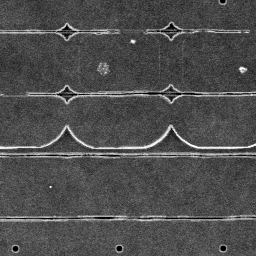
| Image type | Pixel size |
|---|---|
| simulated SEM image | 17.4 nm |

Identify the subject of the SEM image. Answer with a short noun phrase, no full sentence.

wiring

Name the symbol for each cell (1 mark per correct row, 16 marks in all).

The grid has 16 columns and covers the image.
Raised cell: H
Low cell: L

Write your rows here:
HHHHHHHHHHHHHHHH
HHHHHHHHHHHHHHHH
HHHHHHHHHHHHHHHH
HHHHHHHHHHHHHHHH
HHHHHHHHHHHHHHHH
HHHHHHHHHHHHHHHH
HHHHHHHHHHHHHHHH
HHHHHHHHHHHHHHHH
HHHHLHHHHHLHHHHH
LLLLLLLLLLLLLLLL
LLLLLLLLLLLLLLLL
LLLLLLLLLLLLLLLL
LLLLLLLLLLLLLLLL
LLLLLLLLLLLLLLLL
LLLLLLLLLLLLLLLL
LLLLLLLLLLLLLLLL